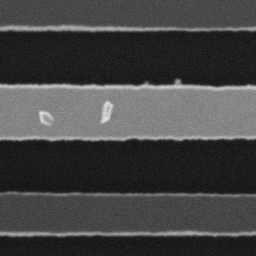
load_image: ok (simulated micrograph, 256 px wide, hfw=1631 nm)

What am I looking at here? lines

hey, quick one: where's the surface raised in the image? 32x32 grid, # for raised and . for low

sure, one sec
################################
################################
################################
################################
................................
................................
................................
................................
................................
................................
................................
################################
################################
################################
################################
################################
################################
..#...#...######......#.........
................................
................................
................................
................................
................................
................................
################################
################################
################################
################################
################################
.......#........................
................................
................................